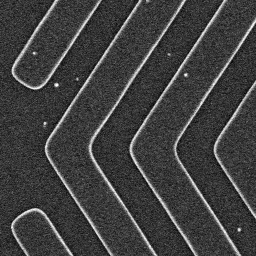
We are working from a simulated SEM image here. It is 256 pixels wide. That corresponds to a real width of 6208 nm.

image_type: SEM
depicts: groups of lines, slits or small figures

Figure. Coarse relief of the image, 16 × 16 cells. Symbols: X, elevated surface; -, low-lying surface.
---XXX--XXX---XX
---XX---XXX--XXX
--XXX--XXX--XXX-
-XXX--XXX---XXX-
-XX---XXX--XXX--
-----XXX--XXX---
----XXX---XXX--X
----XXX--XXX--XX
---XXX--XXX---XX
---XXX--XXX--XXX
---XXX---XX---XX
----XXX--XXX---X
-----XXX--XXX--X
-XX--XXX---XX---
-XXX--XXX--XXX--
-XXX---XX---XXX-